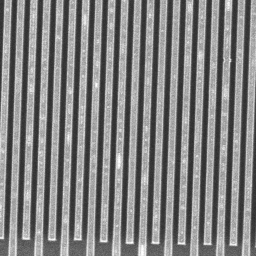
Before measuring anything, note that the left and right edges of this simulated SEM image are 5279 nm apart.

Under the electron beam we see parallel lines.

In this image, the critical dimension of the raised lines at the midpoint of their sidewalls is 149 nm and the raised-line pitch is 267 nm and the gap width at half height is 129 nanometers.